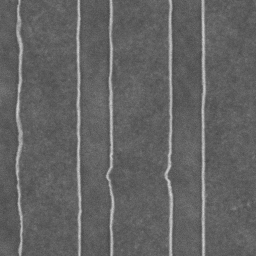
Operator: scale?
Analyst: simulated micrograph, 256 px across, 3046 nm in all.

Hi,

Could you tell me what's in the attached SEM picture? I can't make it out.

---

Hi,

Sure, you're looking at one or a few lines or trenches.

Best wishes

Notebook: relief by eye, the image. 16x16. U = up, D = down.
DUUUUDDUUUUDDUUU
DUUUUDDUUUUDDUUU
DUUUUDDUUUUDDUUU
DUUUUDDUUUUDDUUU
DUUUUDDUUUUDDUUU
DUUUUDDUUUUDDUUU
DUUUUDDUUUUDDUUU
DUUUUDDUUUUDDUUU
DUUUUDDUUUUDDUUU
DUUUUDDUUUUDDUUU
DUUUUDDUUUUDDUUU
DUUUUDDUUUUDDUUU
DUUUUDDUUUUDDUUU
DUUUUDDUUUUDDUUU
DUUUUDDUUUUDDUUU
DUUUUDDUUUUDDUUU